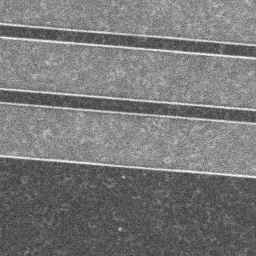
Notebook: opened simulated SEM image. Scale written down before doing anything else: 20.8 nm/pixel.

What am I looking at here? one or a few lines or trenches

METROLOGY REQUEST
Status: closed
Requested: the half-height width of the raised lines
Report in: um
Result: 0.293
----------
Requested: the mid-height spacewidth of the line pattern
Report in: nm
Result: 1070